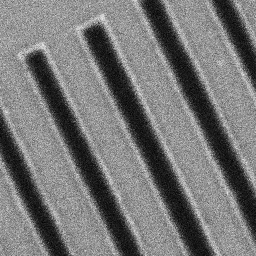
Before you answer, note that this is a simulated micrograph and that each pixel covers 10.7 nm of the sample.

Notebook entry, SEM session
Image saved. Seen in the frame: one or a few lines or trenches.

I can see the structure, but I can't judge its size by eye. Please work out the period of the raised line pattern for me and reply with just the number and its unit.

682 nm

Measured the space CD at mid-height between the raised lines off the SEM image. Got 371 nanometres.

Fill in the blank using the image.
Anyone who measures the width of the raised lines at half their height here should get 311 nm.